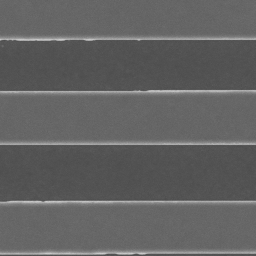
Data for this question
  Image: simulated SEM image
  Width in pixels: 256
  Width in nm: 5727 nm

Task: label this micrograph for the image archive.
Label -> lines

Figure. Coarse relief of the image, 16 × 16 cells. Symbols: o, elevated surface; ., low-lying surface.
oooooooooooooooo
oooooooooooooooo
.ooo.o..o.......
................
................
................
oooooooooooooooo
oooooooooooooooo
oooooooooooooooo
................
................
................
................
oooooooooooooooo
oooooooooooooooo
oooooooooooooooo